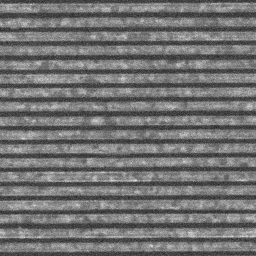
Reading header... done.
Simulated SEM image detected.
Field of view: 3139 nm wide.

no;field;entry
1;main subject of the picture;parallel lines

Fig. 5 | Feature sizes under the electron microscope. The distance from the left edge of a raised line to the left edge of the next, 172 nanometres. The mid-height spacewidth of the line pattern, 5.87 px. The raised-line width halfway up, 96.6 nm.